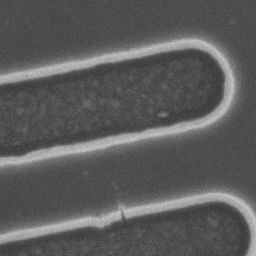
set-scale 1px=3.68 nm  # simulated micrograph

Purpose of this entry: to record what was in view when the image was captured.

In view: one or a few lines or trenches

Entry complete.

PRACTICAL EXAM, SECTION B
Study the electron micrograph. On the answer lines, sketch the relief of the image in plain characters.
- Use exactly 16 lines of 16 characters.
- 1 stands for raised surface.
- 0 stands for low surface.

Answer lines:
1111111111111111
1111111111111111
1111111111111111
1111111100000011
1110000000000011
0000000000000011
0000000000000011
0000000000000111
0000000001111111
0001111111111111
1111111111111111
1111111111111111
1111111111110011
1111111000000000
1100000000000000
0000000000000000